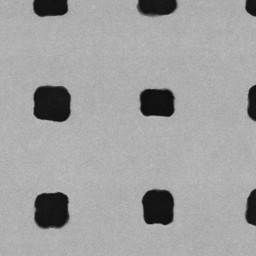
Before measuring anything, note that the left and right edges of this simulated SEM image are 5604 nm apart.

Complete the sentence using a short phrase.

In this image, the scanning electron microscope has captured holes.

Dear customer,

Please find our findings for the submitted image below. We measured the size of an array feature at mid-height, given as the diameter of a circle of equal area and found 0.787 micrometres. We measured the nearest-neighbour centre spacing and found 2290 nm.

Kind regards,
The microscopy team